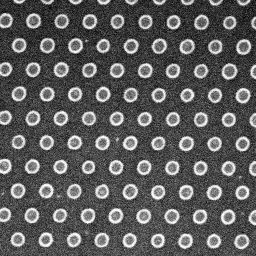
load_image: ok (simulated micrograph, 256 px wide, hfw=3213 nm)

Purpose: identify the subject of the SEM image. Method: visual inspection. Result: a regular array of raised bodies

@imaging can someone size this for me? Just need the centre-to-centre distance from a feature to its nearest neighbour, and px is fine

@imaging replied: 27.8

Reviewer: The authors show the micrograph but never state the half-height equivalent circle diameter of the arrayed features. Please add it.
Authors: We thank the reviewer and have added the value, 0.158 microns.